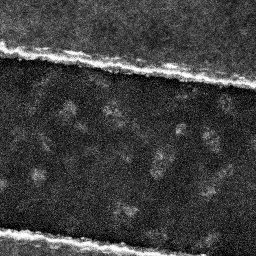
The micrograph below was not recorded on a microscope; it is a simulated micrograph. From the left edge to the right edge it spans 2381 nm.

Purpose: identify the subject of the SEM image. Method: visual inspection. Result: one or a few lines or trenches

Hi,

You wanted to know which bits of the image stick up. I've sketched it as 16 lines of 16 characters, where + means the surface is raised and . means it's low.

++++++++++++++++
++++++++++++++++
++++++++++++++++
...+++++++++++++
..........++++++
................
................
................
................
................
................
................
................
................
................
+++++++.........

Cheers